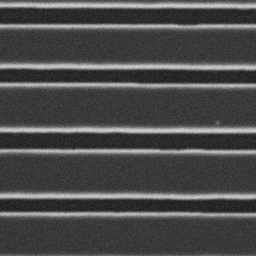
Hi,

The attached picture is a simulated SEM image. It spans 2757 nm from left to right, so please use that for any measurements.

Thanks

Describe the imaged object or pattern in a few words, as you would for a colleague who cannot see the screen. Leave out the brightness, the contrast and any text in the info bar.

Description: lines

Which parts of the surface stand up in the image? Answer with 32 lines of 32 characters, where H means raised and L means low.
HHHHHHHHHHHHHHHHHHHHHHHHHHHHHHHH
LLLLLLLLLLLLLLLLLLLLLLLLLLLLLLLL
LLLLLLLLLLLLLLLLLLLLLLLLLLLLLLLL
HHHHHHHHHHHHHHHHHHHHHHHHHHHHHHHH
HHHHHHHHHHHHHHHHHHHHHHHHHHHHHHHH
HHHHHHHHHHHHHHHHHHHHHHHHHHHHHHHH
HHHHHHHHHHHHHHHHHHHHHHHHHHHHHHHH
HHHHHHHHHHHHHHHHHHHHHHHHHHHHHHHH
LLLLLLLLLLLLLLLLLLLLLLLLLLLLLLLL
LLLLLLLLLLLLLLLLLLLLLLLLLLLLLLLL
LLLLLLLLLLLLLLLLLLLLLLLLLLLLLLLL
HHHHHHHHHHHHHHHHHHHHHHHHHHHHHHHH
HHHHHHHHHHHHHHHHHHHHHHHHHHHHHHHH
HHHHHHHHHHHHHHHHHHHHHHHHHHHHHHHH
HHHHHHHHHHHHHHHHHHHHHHHHHHHHHHHH
HHHHHHHHHHHHHHHHHHHHHHHHHHHHHHHH
LLLLLLLLLLLLLLLLLLLLLLLLLLLLLLLL
LLLLLLLLLLLLLLLLLLLLLLLLLLLLLLLL
LLLLLLLLLLLLLLLLLLLLLLLLLLLLLLLL
HHHHHHHHHHHHHHHHHHHHHHHHHHHHHHHH
HHHHHHHHHHHHHHHHHHHHHHHHHHHHHHHH
HHHHHHHHHHHHHHHHHHHHHHHHHHHHHHHH
HHHHHHHHHHHHHHHHHHHHHHHHHHHHHHHH
HHHHHHHHHHHHHHHHHHHHHHHHHHHHHHHH
HHHHHHHHHHHHHHHHHHHHHHHHHHHHHHHH
LLLLLLLLLLLLLLLLLLLLLLLLLLLLLLLL
LLLLLLLLLLLLLLLLLLLLLLLLLLLLLLLL
HHHHHHHHHHHHHHHHHHHHHHHHHHHHHHHH
HHHHHHHHHHHHHHHHHHHHHHHHHHHHHHHH
HHHHHHHHHHHHHHHHHHHHHHHHHHHHHHHH
HHHHHHHHHHHHHHHHHHHHHHHHHHHHHHHH
HHHHHHHHHHHHHHHHHHHHHHHHHHHHHHHH